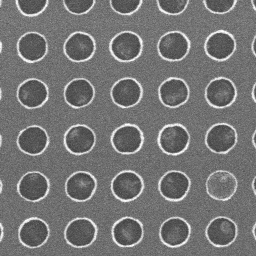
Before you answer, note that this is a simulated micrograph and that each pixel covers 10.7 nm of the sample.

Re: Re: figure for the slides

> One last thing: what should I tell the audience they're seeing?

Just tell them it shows a regular array of holes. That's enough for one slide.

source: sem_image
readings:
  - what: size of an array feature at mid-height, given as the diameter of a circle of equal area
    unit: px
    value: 29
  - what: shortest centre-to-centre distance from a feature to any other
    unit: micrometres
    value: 0.493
